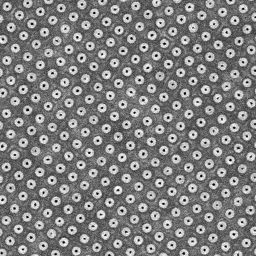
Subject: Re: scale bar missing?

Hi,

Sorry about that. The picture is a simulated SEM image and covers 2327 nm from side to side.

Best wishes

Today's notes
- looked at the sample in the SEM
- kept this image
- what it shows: a regular array of ring-shaped raised bodies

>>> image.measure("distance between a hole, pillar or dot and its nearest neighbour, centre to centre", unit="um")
0.132